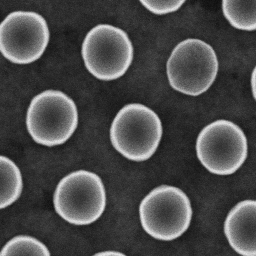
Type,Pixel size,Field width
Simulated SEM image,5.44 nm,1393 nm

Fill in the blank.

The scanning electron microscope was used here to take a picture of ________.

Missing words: raised bodies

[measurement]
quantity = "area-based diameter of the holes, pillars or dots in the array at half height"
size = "0.275 µm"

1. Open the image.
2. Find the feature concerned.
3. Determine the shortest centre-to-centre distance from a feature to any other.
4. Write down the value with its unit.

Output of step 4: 462 nanometres